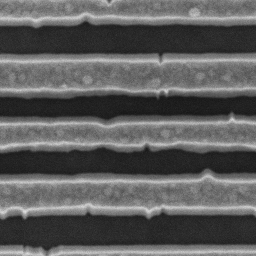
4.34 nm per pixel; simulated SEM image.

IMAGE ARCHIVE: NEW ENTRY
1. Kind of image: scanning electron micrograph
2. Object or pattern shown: one or a few lines or trenches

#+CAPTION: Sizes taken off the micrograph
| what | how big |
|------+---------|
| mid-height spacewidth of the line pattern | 147 nanometers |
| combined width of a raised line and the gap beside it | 0.259 um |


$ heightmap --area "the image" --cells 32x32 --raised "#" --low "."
################################
################################
##########.....######...######..
................................
................................
................................
................................
################################
################################
################################
################################
#####.####......#####.#######...
................................
................................
................................
################################
################################
################################
##.............#...............#
................................
................................
................................
################################
################################
################################
################################
#..#..............#.............
................................
................................
................................
................................
#####..#########################